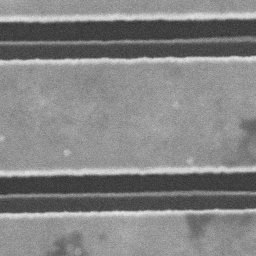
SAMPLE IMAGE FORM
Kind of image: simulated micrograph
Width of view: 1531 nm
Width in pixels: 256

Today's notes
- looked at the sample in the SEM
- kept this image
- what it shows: lines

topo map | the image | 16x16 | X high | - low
XXXXXXXXXXXXXXXX
----------------
----------------
----------------
XXXXXXXXXXXXXXXX
XXXXXXXXXXXXXXXX
XXXXXXXXXXXXXXXX
XXXXXXXXXXXXXXXX
XXXXXXXXXXXXXXXX
XXXXXXXXXXXXXXXX
XXXXXXXXXXXXXXXX
----------------
----------------
XXXXXXXXXXXXXXXX
XXXXXXXXXXXXXXXX
XXXXXXXXXXXXXXXX